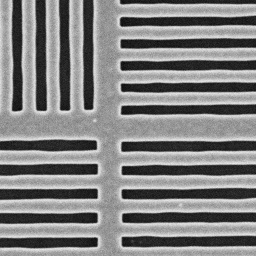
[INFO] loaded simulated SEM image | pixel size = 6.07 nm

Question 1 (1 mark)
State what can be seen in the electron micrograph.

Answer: groups of lines, slits or small figures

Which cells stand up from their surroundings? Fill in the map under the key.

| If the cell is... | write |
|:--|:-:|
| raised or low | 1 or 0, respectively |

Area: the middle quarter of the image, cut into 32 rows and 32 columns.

00111000111111000000000000000000
00111000111111000000000000000000
00111000111111111111111111111111
00111000111111111111111111111111
00111000111111111111111111111111
00111000111111000000000000000000
00111000111111000000000000000000
00111000111111111111111111111111
00111000111111111111111111111111
00111000111111111111111111111111
00111000111111100000000000000000
01111001111111000000000000000000
11111111111111000000000000000000
11111111111111111111111111111111
11111111111111111111111111111111
11111111111111111111111111111111
11111111111111111111111111111111
11111111111111111111111111111111
11111111111111111111111111111111
00000000111111100000000000000000
00000000111111000000000000000000
00000000111111000000000000000000
11111111111111111111111111111111
11111111111111111111111111111111
11111111111111111111111111111111
00000000011111100000000000000000
00000000011111000000000000000000
00000000111111000000000000000000
11111111111111111111111111111111
11111111111111111111111111111111
11111111111111111111111111111111
00000000111111000000000000000000